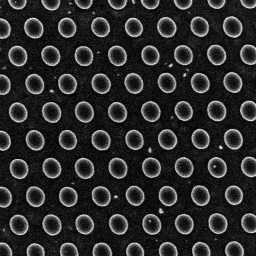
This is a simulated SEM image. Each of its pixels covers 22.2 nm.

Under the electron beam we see a regular array of raised bodies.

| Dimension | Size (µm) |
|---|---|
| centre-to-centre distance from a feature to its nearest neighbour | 0.717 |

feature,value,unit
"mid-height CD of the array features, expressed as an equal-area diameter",0.416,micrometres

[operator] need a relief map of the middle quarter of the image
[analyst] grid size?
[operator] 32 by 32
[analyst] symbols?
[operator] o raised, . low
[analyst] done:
................................
................................
................oo.......o......
oo.....oooo....oooo.....ooo.....
ooo....oooo....ooooo....oooo....
ooo....oooo....ooooo....oooo....
ooo.....ooo.....ooo......oo.....
................................
................................
....o.........................o.
...oooo.....ooo.....ooo.....ooo.
...oooo....oooo.....oooo....oooo
...oooo....oooo.....oooo....oooo
...oooo.....ooo.....oooo.....ooo
................................
................................
................................
ooo....oooo.....ooo.....ooo.....
ooo....oooo.....oooo....oooo....
ooo....oooo.....oooo....oooo....
ooo.....ooo.....ooo.....oooo....
................................
................................
................................
...oooo.....ooo.....oooo....oooo
...oooo....ooooo....oooo....oooo
...oooo....ooooo....oooo....oooo
...oooo.....ooo.....oooo.....ooo
....oo..........................
................................
................................
oo.....oooo.....ooo.....oooo....